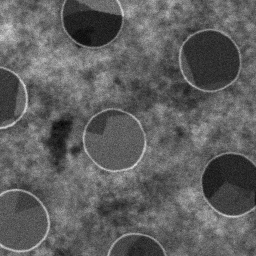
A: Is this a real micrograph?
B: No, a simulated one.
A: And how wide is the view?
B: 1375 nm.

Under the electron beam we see raised bodies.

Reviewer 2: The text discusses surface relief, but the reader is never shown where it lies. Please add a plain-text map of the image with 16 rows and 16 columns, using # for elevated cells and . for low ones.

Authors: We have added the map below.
....####........
....####........
.....##.....##..
...........####.
#..........####.
##..........##..
##..............
#.....###.......
.....####.......
.....####.......
......##.....###
.............###
##...........###
###...........#.
###.............
##.....###......